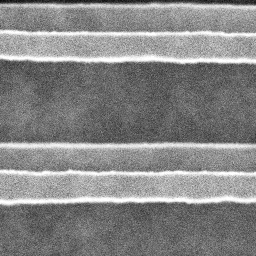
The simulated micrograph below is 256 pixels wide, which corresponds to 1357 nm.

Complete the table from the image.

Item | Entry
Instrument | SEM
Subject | lines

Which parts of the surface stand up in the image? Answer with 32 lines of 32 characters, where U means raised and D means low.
DDDDDDDDDDDDDDDDDDDDDDDDDDDDDDDD
UUUUUUUUUUUUUUUUUUUUUUUUUUUUUUUU
UUUUUUUUUUUUUUUUUUUUUUUUUUUUUUUU
UUUUUUUUUUUUUUUUUUUUUUUUUUUUUUUU
UUUUUUUUUUUUUUUUUUUUUUUUUUUUUUUU
UUUUUUUUUUUUUUUUUUUUUUUUUUUUUUUU
UUUUUUUUUUUUUUUUUUUUUUUUUUUUUUUU
DDDDDDDDDUUUUUUUDDDDUUUUUUUUUUUU
DDDDDDDDDDDDDDDDDDDDDDDDDDDDDDDD
DDDDDDDDDDDDDDDDDDDDDDDDDDDDDDDD
DDDDDDDDDDDDDDDDDDDDDDDDDDDDDDDD
DDDDDDDDDDDDDDDDDDDDDDDDDDDDDDDD
DDDDDDDDDDDDDDDDDDDDDDDDDDDDDDDD
DDDDDDDDDDDDDDDDDDDDDDDDDDDDDDDD
DDDDDDDDDDDDDDDDDDDDDDDDDDDDDDDD
DDDDDDDDDDDDDDDDDDDDDDDDDDDDDDDD
DDDDDDDDDDDDDDDDDDDDDDDDDDDDDDDD
DDDDDDDDDDDDDDDDDDDDDDDDDDDDDDDD
UUUUUUUUUUUUUUUUUUUUUUUUUUUUUUUU
UUUUUUUUUUUUUUUUUUUUUUUUUUUUUUUU
UUUUUUUUUUUUUUUUUUUUUUUUUUUUUUUU
UUUUUUUUUUUUUUUUUUUUUUUUUUUUUUUU
UUUUUUUUUUUUUUUUUUUUUUUUUUUUUUUU
UUUUUUUUUUUUUUUUUUUUUUUUUUUUUUUU
UUUUUUUUUUUUUUUUUUUUUUUUUUUUUUUU
DDDDDDDDDDDDDDDDDDDDDDDDDDDDDDDD
DDDDDDDDDDDDDDDDDDDDDDDDDDDDDDDD
DDDDDDDDDDDDDDDDDDDDDDDDDDDDDDDD
DDDDDDDDDDDDDDDDDDDDDDDDDDDDDDDD
DDDDDDDDDDDDDDDDDDDDDDDDDDDDDDDD
DDDDDDDDDDDDDDDDDDDDDDDDDDDDDDDD
DDDDDDDDDDDDDDDDDDDDDDDDDDDDDDDD